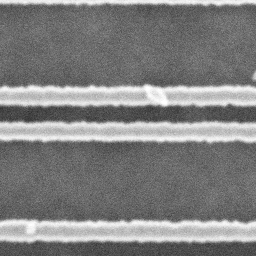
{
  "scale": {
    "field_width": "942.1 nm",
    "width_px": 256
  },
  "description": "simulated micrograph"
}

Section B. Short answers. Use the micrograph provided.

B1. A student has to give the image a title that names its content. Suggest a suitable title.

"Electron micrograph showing lines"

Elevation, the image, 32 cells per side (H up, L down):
LLLLLLLLLLLLLLLLLLLLLLLLLLLHLLLL
LLLLLLLLLLLLLLLLLLLLLLLLLLLLLLLL
LLLLLLLLLLLLLLLLLLLLLLLLLLLLLLLL
LLLLLLLLLLLLLLLLLLLLLLLLLLLLLLLL
LLLLLLLLLLLLLLLLLLLLLLLLLLLLLLLL
LLLLLLLLLLLLLLLLLLLLLLLLLLLLLLLL
LLLLLLLLLLLLLLLLLLLLLLLLLLLLLLLL
LLLLLLLLLLLLLLLLLLLLLLLLLLLLLLLL
LLLLLLLLLLLLLLLLLLLLLLLLLLLLLLLL
LLLLLLLLLLLLLLLLLLLLLLLLLLLLLLLL
LLLLLLLLLLLLLLLLLLLLLLLLLLLLLLLL
HHHHHHHHHHHHHHHHHHHHHHHHHHHHHHHH
HHHHHHHHHHHHHHHHHHHHHHHHHHHHHHHH
LLLLLLLLLLLLLLLLLLLLLLLLLLLLLLLL
LLLLLLLLLLLLLLLLLLLLLLLLLLLLLLLL
HHHHHHHHHHHHHHHHHHHHHHHHHHHHHHHH
HHHHHHHHHHHHHHHHHHHHHHHHHHHHHHHH
LLLLLHLLLLLLLHLLLLLHHHHLHLHHHLHH
LLLLLLLLLLLLLLLLLLLLLLLLLLLLLLLL
LLLLLLLLLLLLLLLLLLLLLLLLLLLLLLLL
LLLLLLLLLLLLLLLLLLLLLLLLLLLLLLLL
LLLLLLLLLLLLLLLLLLLLLLLLLLLLLLLL
LLLLLLLLLLLLLLLLLLLLLLLLLLLLLLLL
LLLLLLLLLLLLLLLLLLLLLLLLLLLLLLLL
LLLLLLLLLLLLLLLLLLLLLLLLLLLLLLLL
LLLLLLLLLLLLLLLLLLLLLLLLLLLLLLLL
LLLLLLLLLLLLLLLLLLLLLLLLLLLLLLLL
LLLLLLLLLLLLLLLLLLLLLLLLLLLLLLLL
HHHHHHHHHHHHHHHHHHHHHHHHHHHHHHHH
HHHHHHHHHHHHHHHHHHHHHHHHHHHHHHHH
LLLLLLLLLLLLLLLLLLLLLLLLLLLLLLLL
LLLLLLLLLLLLLLLLLLLLLLLLLLLLLLLL